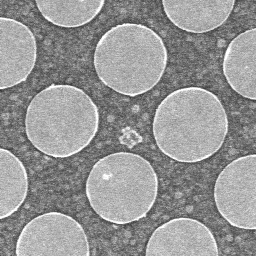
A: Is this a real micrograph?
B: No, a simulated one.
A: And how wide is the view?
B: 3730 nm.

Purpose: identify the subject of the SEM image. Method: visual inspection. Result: raised bodies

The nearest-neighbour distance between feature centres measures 89.6 px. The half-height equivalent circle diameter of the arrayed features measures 1040 nm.